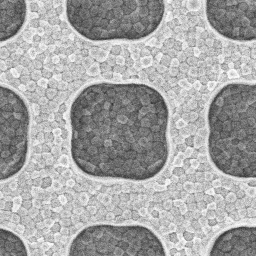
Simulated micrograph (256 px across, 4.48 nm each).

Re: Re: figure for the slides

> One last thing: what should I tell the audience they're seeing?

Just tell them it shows holes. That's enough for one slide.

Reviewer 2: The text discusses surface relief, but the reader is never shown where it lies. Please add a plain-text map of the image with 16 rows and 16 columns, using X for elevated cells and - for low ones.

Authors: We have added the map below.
--XX------XXX---
--XX------XXX---
-XXXXX---XXXXX--
XXXXXXXXXXXXXXXX
XXXXXXXXXXXXXXXX
-XXXX-----XXXX--
--XXX-----XXX---
--XX-------XX---
--XX------XXX---
--XX-------XX---
-XXXX-----XXXX--
XXXXXXXXXXXXXXXX
XXXXXXXXXXXXXXXX
XXXXXXXXXXXXXXXX
-XXXX-----XXXX--
--XX------XXX---